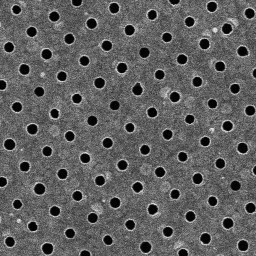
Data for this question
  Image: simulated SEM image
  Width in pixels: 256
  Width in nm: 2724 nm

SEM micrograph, a regular array of holes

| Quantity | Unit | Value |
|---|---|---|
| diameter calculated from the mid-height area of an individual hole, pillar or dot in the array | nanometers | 103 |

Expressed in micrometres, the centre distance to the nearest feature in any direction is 0.285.